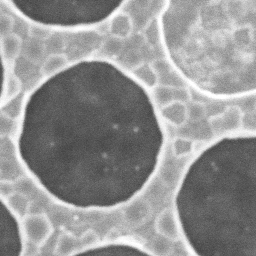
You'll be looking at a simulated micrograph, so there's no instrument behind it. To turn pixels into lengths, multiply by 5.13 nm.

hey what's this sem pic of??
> holes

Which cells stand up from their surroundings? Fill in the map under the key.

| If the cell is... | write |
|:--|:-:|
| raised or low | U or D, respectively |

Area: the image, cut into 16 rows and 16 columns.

UDDDDDDUUUUUUUUU
UUUDDDUUUUUUUUUU
UUUUUUUUUUUUUUUU
UUUUUUUUUUUUUUUU
UUUUDDDDUUUUUUUU
UUDDDDDDDUUUUUUU
UUDDDDDDDDUUUUUU
UDDDDDDDDDUUUUUU
UDDDDDDDDDUUUUUD
UDDDDDDDDDUUUDDD
UUDDDDDDDDUUDDDD
UUUDDDDDDUUDDDDD
UUUUDDDDUUUDDDDD
DUUUUUUUUUUDDDDD
DUUUUUUUUUUDDDDD
DUUUUUDDUUUUDDDD